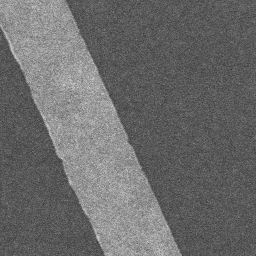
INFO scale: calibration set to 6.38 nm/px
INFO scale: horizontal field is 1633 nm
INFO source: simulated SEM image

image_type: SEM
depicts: one or a few lines or trenches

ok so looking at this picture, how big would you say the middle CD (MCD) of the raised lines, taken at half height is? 438 nm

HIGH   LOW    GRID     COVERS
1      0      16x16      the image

1111000000000000
1111100000000000
0111100000000000
0111110000000000
0111110000000000
0011111000000000
0011111000000000
0001111000000000
0001111100000000
0000111100000000
0000111110000000
0000111110000000
0000011111000000
0000011111000000
0000001111100000
0000001111100000